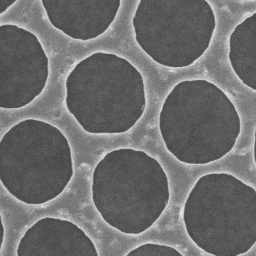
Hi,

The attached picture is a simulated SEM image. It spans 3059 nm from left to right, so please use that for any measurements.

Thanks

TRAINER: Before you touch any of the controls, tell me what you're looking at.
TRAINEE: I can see holes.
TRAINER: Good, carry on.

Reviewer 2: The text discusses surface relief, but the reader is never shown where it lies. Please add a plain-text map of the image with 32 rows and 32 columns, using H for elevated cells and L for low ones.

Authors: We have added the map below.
LLHHHLLLLLLLLLLHHLLLLLLLLLHHHHHH
HHHHHHLLLLLLLLLHHLLLLLLLLLLHHHHH
HHHHHHLLLLLLLLHHHLLLLLLLLLLHHHHL
LLLHHHHLLLLLLHHHHLLLLLLLLLLHHLLL
LLLLHHHHHLLLHHHHHLLLLLLLLLHHHLLL
LLLLLHHHHHHHHHHHHLLLLLLLLLHHHLLL
LLLLLLHHHHHHHHHHHHLLLLLLLLHHHLLL
LLLLLLHHHHLLLLLLHHHLLLLLHHHHHLLL
LLLLLLHHHLLLLLLLLHHHHHHHHHHHHLLL
LLLLLLHHLLLLLLLLLLHHHHHHHHHHHHLL
LLLLLLHHLLLLLLLLLLHHHHLLLLLHHHHL
LLLLLHHHLLLLLLLLLLHHHLLLLLLLHHHH
LLLLHHHHLLLLLLLLLLHHHLLLLLLLLHHH
HLHHHHHHLLLLLLLLLLHHLLLLLLLLLHHH
HHHHHHHHHLLLLLLLLLHHLLLLLLLLLLHH
HHLLLLHHHHLLLLLLLHHHLLLLLLLLLLHH
HLLLLLLLHHHLLLLLHHHHLLLLLLLLLLHH
LLLLLLLLHHHHHHHHHHHHLLLLLLLLLLHH
LLLLLLLLLHHHHHHHHHHHHLLLLLLLLHHH
LLLLLLLLLHHHHLLLLLLHHHLLLLLLHHHH
LLLLLLLLLHHHLLLLLLLLHHHHHHHHHHHH
LLLLLLLLLHHHLLLLLLLLLHHHHHHHHHHH
LLLLLLLLLHHHLLLLLLLLLHHHHLLLLLHH
HLLLLLLLHHHHLLLLLLLLLHHHLLLLLLLL
HHLLLLLHHHHHLLLLLLLLLHHHLLLLLLLL
HHHHLHHHHHHHLLLLLLLLLHHLLLLLLLLL
HHHHHHHHHHHHLLLLLLLLHHHLLLLLLLLL
HHHHHLLLHHHHHLLLLLLLHHHLLLLLLLLL
HHHHLLLLLLHHHHLLLLLHHHHLLLLLLLLL
HHHLLLLLLLLHHHHHHHHHHHHHLLLLLLLL
HHLLLLLLLLLLHHHHHHLHHHHHHLLLLLLL
HHLLLLLLLLLLHHHHLLLLLLHHHHLLLLLH